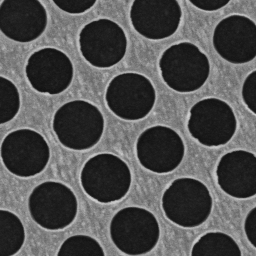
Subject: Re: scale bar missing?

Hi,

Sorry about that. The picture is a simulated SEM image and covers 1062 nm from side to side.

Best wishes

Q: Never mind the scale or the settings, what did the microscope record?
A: a regular array of holes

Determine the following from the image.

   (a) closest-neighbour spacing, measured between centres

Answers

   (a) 248 nanometers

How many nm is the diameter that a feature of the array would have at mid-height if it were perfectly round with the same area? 198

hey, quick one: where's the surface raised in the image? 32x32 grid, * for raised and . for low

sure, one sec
.....**.....*****.....**....****
......***.******.......*********
......******..**......******...*
......****.....**.....*****.....
*....*****......**...******.....
**********......******..***.....
*****...**......*****....**.....
****.....**....*****......**...*
***......***********......******
***......******...**......*****.
..**.....*****.....**....******.
..***...*****......***********..
..***********......******..****.
..******....**.....*****.....**.
..*****......**...******.....***
*******......***********......**
**..***......*****....**.....***
*.....*.....*****......**....***
......***..******......*********
......******..***......*****....
*.....*****.....**....*****.....
*....*****......***..******.....
**********......******..***.....
****....***.....*****.....**....
****.....**....*****......***..*
****......**********......******
.***.....******....**.....*****.
..**.....*****......*.....*****.
...***..******......***********.
...*******.***......*****....**.
...*****....**.....*****......**
..*****......**...******......**